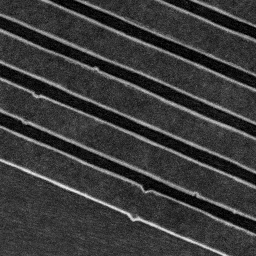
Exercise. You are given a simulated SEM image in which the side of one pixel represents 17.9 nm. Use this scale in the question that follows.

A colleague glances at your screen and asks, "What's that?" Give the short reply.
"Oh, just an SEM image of parallel lines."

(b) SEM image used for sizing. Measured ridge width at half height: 546 nm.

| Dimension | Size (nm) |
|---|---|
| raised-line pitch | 793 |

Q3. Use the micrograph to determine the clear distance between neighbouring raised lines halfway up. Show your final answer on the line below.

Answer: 0.248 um